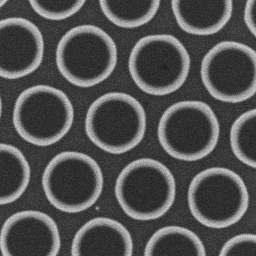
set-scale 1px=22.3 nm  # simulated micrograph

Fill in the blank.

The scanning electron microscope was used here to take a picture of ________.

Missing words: an array of small figures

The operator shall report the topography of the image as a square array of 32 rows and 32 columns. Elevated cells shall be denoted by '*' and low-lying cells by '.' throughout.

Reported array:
....******...*******..*******..*
.....****....******...*******..*
.**...........*****...*******..*
*****....***...........*****...*
*****...******.....**...........
*****..*******...******....***..
*****..*******..*******...******
*****..*******..********.*******
*****..*******..********.*******
***.....*****....******..*******
.........***.....******...******
...*****..........***.....******
..*******...*****...........**..
..*******..*******...*****......
..*******..*******..*******...**
..*******..*******..*******..***
..******...*******..*******..***
...****....*******..*******..***
**...........***.....******..***
***....****...........****....**
***...******....****...........*
****..*******..******....****...
****.********..*******..******..
***..********.********..*******.
**....******...*******..*******.
.......*****...******...*******.
...**...........*****...*******.
.*****......**...........*****..
*******...******.....**.........
*******..*******...******.....**
*******..*******..*******...****
*******..*******..********..****